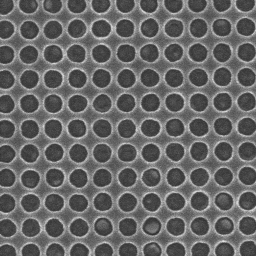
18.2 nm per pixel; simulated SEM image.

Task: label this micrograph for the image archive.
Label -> a regular array of holes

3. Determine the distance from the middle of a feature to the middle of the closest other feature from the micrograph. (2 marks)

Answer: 434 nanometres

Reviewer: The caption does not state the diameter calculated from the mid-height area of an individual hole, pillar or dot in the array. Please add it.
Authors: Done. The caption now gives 340 nm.